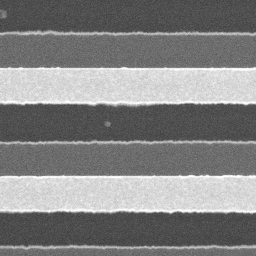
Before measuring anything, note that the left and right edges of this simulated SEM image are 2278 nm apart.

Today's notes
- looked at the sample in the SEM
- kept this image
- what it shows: lines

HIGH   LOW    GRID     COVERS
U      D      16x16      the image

DDDDDDDDDDDDDDDD
DDDDDDDDDDDDDDDD
UUUUUUUUUUUUUUUU
UUUUUUUUUUUUUUUU
UUUUUUUUUUUUUUUU
UUUUUUUUUUUUUUUU
DDDDDDDDDDDDDDDD
DDDDDDDDDDDDDDDD
DDDDDDDDDDDDDDDD
UUUUUUUUUUUUUUUU
UUUUUUUUUUUUUUUU
UUUUUUUUUUUUUUUU
UUUUUUUUUUUUUUUU
DDDDDDDDDDDDDDDD
DDDDDDDDDDDDDDDD
UUUUUUUUUUUUUUUU